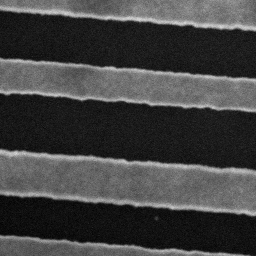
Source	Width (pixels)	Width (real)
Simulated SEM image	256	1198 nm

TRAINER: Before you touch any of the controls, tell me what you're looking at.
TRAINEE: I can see lines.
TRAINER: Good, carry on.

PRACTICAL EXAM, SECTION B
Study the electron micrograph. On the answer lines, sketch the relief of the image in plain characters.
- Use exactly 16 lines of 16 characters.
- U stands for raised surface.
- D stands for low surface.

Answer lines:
UUUUUUUUUUUUUUUU
DDDDDDDDDDUUUUUU
DDDDDDDDDDDDDDDD
DDDDDDDDDDDDDDDD
UUUUUUUUUUUDDDDD
UUUUUUUUUUUUUUUU
DDDDDDDDDUUUUUUU
DDDDDDDDDDDDDDDD
DDDDDDDDDDDDDDDD
UUDDDDDDDDDDDDDD
UUUUUUUUUUUUUUUD
UUUUUUUUUUUUUUUU
DDDDUUUUUUUUUUUU
DDDDDDDDDDDDDDDD
DDDDDDDDDDDDDDDD
UUUUUUUUUDDDDDDD